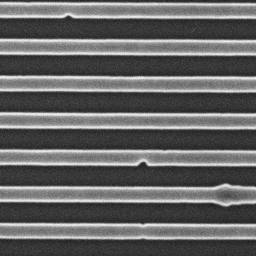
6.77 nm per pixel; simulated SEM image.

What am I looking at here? parallel lines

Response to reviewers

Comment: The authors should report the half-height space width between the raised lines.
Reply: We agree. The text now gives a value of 154 nanometres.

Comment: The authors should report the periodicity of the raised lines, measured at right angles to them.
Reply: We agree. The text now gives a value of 0.249 um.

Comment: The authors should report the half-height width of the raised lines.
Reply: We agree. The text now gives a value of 94.8 nanometres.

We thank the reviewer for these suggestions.